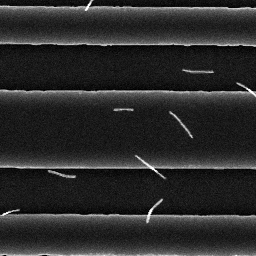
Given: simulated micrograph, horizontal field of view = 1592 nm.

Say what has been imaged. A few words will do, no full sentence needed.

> lines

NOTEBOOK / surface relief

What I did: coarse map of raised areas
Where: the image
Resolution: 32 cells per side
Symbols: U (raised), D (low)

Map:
DDDDDDDDDDDDDDDDDDDDDDDDDDDDDDDD
UUUUUUUUUUUUUUUUUUUUUUUUUUUUUUUU
UUUUUUUUUUUUUUUUUUUUUUUUUUUUUUUU
UUUUUUUUUUUUUUUUUUUUUUUUUUUUUUUU
UUUUUUUUUUUUUUUUUUUUUUUUUUUUUUUU
DDDDUDDUUUUUUUUUUUUUUUUUUUUUUUUU
DDDDDDDDDDDDDDDDDDDDDDDDDDDDDDDD
DDDDDDDDDDDDDDDDDDDDDDDDDDDDDDDD
DDDDDDDDDDDDDDDDDDDDDDDDDDDDDDDD
DDDDDDDDDDDDDDDDDDDDDDDDDDDDDDDD
DDDDDDDDDDDDDDDDDDDDDDDDDDDDDDDD
UUUUUUUUUUUDUUUUUUUUUUDDDDDDDDDU
UUUUUUUUUUUUUUUUUUUUUUUUUUUUUUUU
UUUUUUUUUUUUUUUUUUUUUUUUUUUUUUUU
UUUUUUUUUUUUUUUUUUUUUUUUUUUUUUUU
UUUUUUUUUUUUUUUUUUUUUUUUUUUUUUUU
UUUUUUUUUUUUUUUUUUUUUUUUUUUUUUUU
UUUUUUUUUUUUUUUUUUUUUUUUUUUUUUUU
UUUUUUUUUUUUUUUUUUUUUUUUUUUUUUUU
UUUUUUUUUUUUUUUUUUUUUUUUUUUUUUUU
UUUUUUUUUUUUUUUUUUUUUUUUUUUUUUUU
DDDDDDDDDDDDDDDDDDDDDDDDDDDDDDDD
DDDDDDDDDDDDDDDDDDDDDDDDDDDDDDDD
DDDDDDDDDDDDDDDDDDDDDDDDDDDDDDDD
DDDDDDDDDDDDDDDDDDDDDDDDDDDDDDDD
DDDDDDDDDDDDDDDDDDDDDDDDDDDDDDDD
DDDDDDDDDDDDDDDDDDDDDDDDDDDDDDDD
UUUUUUUUUUUUUUUUUUUUUUUUUUUUUUUU
UUUUUUUUUUUUUUUUUUUUUUUUUUUUUUUU
UUUUUUUUUUUUUUUUUUUUUUUUUUUUUUUU
UUUUUUUUUUUUUUUUUUUUUUUUUUUUUUUU
UUUUUUUUUUUUUUUUUUUUUUUUUUUUUUUU